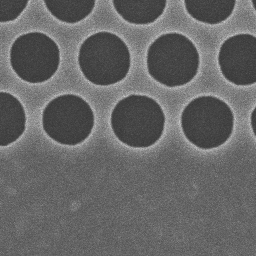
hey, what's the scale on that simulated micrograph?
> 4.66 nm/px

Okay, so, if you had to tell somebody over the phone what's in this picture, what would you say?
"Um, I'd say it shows holes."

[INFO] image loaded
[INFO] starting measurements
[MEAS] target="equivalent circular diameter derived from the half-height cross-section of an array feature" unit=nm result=246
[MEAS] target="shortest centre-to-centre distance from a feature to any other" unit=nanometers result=324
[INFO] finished